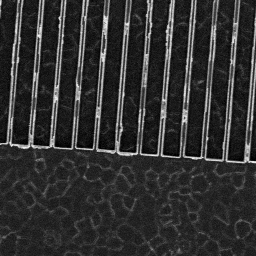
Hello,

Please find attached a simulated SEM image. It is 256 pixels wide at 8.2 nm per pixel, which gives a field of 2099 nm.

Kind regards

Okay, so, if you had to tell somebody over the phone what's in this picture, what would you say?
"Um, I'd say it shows parallel lines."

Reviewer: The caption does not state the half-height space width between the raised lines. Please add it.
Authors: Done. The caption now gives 139 nm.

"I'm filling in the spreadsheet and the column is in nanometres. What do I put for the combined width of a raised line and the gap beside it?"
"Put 177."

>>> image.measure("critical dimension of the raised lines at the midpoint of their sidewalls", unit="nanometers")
40.9